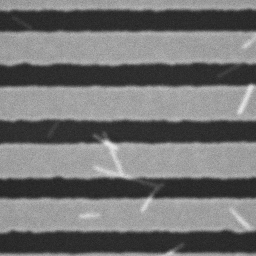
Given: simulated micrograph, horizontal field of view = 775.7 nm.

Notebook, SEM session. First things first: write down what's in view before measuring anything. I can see lines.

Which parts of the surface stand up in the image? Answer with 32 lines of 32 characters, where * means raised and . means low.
********************************
................................
................................
................................
********************************
********************************
********************************
********************************
................................
................................
................................
********************************
********************************
********************************
********************************
................................
................................
................................
********************************
********************************
********************************
********************************
................................
................................
................................
********************************
********************************
********************************
********************************
................................
................................
................................